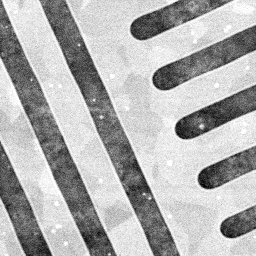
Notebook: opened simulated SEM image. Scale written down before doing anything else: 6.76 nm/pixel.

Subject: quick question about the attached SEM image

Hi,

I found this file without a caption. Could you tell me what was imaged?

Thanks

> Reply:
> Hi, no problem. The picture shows groups of lines, slits or small figures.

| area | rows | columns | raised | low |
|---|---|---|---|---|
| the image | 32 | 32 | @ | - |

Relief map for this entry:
-@@@@----@@@@@@@@@@@@--------@@@
-@@@@----@@@@@@@@@@-------@@@@@@
-@@@@@---@@@@@@@@-------@@@@@@@@
--@@@@----@@@@@@------@@@@@@@@@-
--@@@@@---@@@@@@----@@@@@@@@@---
---@@@@----@@@@@@@@@@@@@@@@-----
---@@@@@---@@@@@@@@@@@@@--------
----@@@@----@@@@@@@@@@--------@@
@---@@@@@---@@@@@@@@-------@@@@@
@----@@@@----@@@@@@------@@@@@@@
@----@@@@@---@@@@@@----@@@@@@@@@
@@----@@@@----@@@@@@@@@@@@@@@@--
@@----@@@@----@@@@@@@@@@@@@-----
@@@---@@@@@---@@@@@@@@@@@-------
@@@----@@@@----@@@@@@@@-------@@
@@@@---@@@@@---@@@@@@@------@@@@
@@@@----@@@@----@@@@@@----@@@@@@
@@@@@---@@@@@---@@@@@@@@@@@@@@@@
-@@@@----@@@@----@@@@@@@@@@@@@@-
-@@@@----@@@@----@@@@@@@@@@@@---
--@@@@----@@@@---@@@@@@@@@------
--@@@@----@@@@----@@@@@@@-------
--@@@@@---@@@@@---@@@@@@@----@@@
---@@@@----@@@@----@@@@@@--@@@@@
---@@@@@---@@@@@---@@@@@@@@@@@@@
----@@@@----@@@@----@@@@@@@@@@@@
@---@@@@@---@@@@@---@@@@@@@@@@--
@----@@@@----@@@@----@@@@@@@----
@@---@@@@@---@@@@@---@@@@@@-----
@@----@@@@----@@@@----@@@@@@--@@
@@----@@@@@---@@@@----@@@@@@@@@@
@@@---@@@@@----@@@@---@@@@@@@@@@